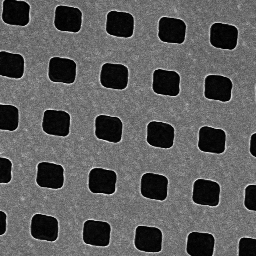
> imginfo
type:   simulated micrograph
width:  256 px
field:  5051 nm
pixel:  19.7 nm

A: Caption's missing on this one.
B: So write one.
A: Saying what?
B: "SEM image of a regular array of holes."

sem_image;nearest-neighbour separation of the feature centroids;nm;1030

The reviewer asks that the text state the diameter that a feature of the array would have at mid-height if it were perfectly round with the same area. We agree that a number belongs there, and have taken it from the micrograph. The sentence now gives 558 nm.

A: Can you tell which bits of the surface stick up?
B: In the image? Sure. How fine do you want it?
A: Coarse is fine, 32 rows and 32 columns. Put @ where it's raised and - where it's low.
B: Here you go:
---@@@@@@@@@@@@@@@@@@@@@@@@@@@@@
----@@@---@@@@-@@@@@@@@@@@@@@@@@
----@@@---@@@----@@@---@@@@@@@@@
@@@@@@@---@@@----@@@---@@@---@@@
@@@@@@@@@@@@@@@-@@@@---@@@----@@
@@@@@@@@@@@@@@@@@@@@@@@@@@----@@
-@@@@@@@@@@@@@@@@@@@@@@@@@@@@@@@
---@@@---@@@@@@@@@@@@@@@@@@@@@@@
---@@@---@@@@---@@@@@@@@@@@@@@@@
@--@@@---@@@@---@@@---@@@@--@@@@
@@@@@@@@@@@@@---@@@---@@@@---@@@
@@@@@@@@@@@@@@@@@@@---@@@@---@@@
@@@@@@@@@@@@@@@@@@@@@@@@@@@--@@@
--@@@@@@@@@@@@@@@@@@@@@@@@@@@@@@
--@@@----@@@-@@@@@@@@@@@@@@@@@@@
--@@@----@@@---@@@@--@@@@@@@@@@@
@@@@@@---@@@---@@@----@@@---@@@@
@@@@@@@@@@@@@--@@@----@@@---@@@-
@@@@@@@@@@@@@@@@@@@@-@@@@---@@@-
@@@@@@@@@@@@@@@@@@@@@@@@@@@@@@@@
-@@@@--@@@@@@@@@@@@@@@@@@@@@@@@@
-@@@@---@@@---@@@@@@@@@@@@@@@@@@
-@@@@---@@@----@@@---@@@@-@@@@@@
@@@@@@@@@@@---@@@@---@@@---@@@@-
@@@@@@@@@@@@@@@@@@---@@@---@@@@-
@@@@@@@@@@@@@@@@@@@@@@@@@--@@@@-
@@@@@@@@@@@@@@@@@@@@@@@@@@@@@@@@
-@@@---@@@@@@@@@@@@@@@@@@@@@@@@@
-@@@---@@@----@@@---@@@@@@@@@@@@
@@@@---@@@----@@@---@@@@---@@@@@
@@@@@@@@@@@--@@@@---@@@----@@@--
@@@@@@@@@@@@@@@@@@--@@@----@@@--